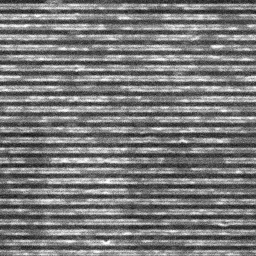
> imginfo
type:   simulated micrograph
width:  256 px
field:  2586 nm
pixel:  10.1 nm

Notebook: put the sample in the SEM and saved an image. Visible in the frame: parallel lines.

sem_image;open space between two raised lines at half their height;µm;0.0543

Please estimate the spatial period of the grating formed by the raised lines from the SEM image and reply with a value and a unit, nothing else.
104 nm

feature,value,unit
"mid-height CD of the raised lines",49.2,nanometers